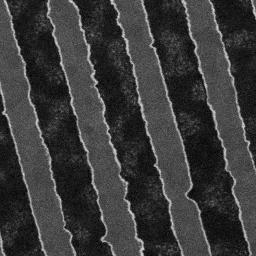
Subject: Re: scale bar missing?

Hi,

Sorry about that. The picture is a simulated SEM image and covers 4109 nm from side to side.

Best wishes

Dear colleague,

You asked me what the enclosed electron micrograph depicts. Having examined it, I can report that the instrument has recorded one or a few lines or trenches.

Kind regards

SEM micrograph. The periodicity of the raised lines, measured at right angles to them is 66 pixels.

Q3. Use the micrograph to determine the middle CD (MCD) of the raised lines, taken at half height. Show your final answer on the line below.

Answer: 459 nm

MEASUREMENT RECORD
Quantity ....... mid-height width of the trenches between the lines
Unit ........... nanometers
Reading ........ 604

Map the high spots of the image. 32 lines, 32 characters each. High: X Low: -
X-----XXX-----XXXX-----XXX------
X-----XXXX-----XXX-----XXXX-----
X-----XXXX-----XXX------XXX-----
XX-----XXX-----XXXX-----XXX-----
XX-----XXXX----XXXX-----XXXX----
XX-----XXXX-----XXX-----XXXX----
XX-----XXXX-----XXX-----XXXX----
XXX-----XXX-----XXXX-----XXXX---
XXX-----XXXX-----XXX-----XXXX---
XXX-----XXXX-----XXX-----XXXX---
XXXX-----XXX-----XXXX-----XXX---
XXXX-----XXX-----XXXX-----XXXX--
XXXX-----XXXX----XXXX-----XXXX--
-XXX-----XXXX-----XXX-----XXXX--
-XXXX----XXXX-----XXXX-----XXX--
-XXXX-----XXX-----XXXX-----XXX--
-XXXX-----XXXX----XXXX-----XXXX-
--XXX-----XXXX-----XXXX-----XXX-
--XXXX-----XXX-----XXXX-----XXX-
--XXXX-----XXX-----XXXX-----XXX-
--XXXX-----XXXX----XXXX-----XXXX
---XXX------XXX-----XXXX-----XXX
---XXXX-----XXX-----XXXX-----XXX
---XXXX-----XXXX----XXXX-----XXX
----XXX-----XXXX-----XX------XXX
----XXXX----XXXX-----XXXX-----XX
----XXXX-----XXX-----XXXX-----XX
----XXXX-----XXXX----XXXX-----XX
-----XXX-----XXXX-----XXX-----XX
-----XXXX----XXXX-----XXXX-----X
-----XXXX-----XXXX----XXXX-----X
------XXX-----XXXX-----XXX-----X